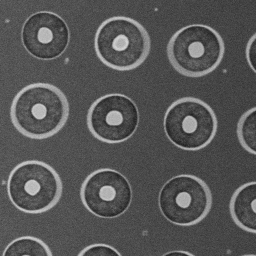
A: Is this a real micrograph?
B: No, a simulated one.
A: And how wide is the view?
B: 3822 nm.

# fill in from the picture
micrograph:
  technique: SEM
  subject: an array of small figures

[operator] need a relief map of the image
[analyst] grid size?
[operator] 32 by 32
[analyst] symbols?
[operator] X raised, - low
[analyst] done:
XXXXXXXXXXXXXXXXXXXXXXXXXXXXXXXX
XXXXXXXXXXXXXXXXXXXXXXXXXXXXXXXX
XXX-----XXXXXX--XXXXXXXXXXXXXXXX
XXX-----XXXXX-----XXXXX---XXXXXX
XXX--X---XXX------XXXX-----XXXXX
XXX-----XXXX--XX--XXX---X---XXX-
XXXX----XXXX------XXX---X---XXX-
XXXXXXXXXXXXX-----XXXX-----XXXX-
XXXXXXXXXXXXXXX-XXXXXX-----XXXXX
XXXXXXXXXXXXXXXXXXXXXXXXXXXXXXXX
XXXXXXXXXXXXXXXXXXXXXXXXXXXXXXXX
XXX----XXXXXXXXXXXXXXXXXXXXXXXXX
XX------XXXX----XXXXXXX-XXXXXXXX
XX--XX--XXXX-----XXXX-----XXXXXX
XX--X---XXX--XX--XXXX------XXXX-
XX------XXX---X--XXXX--XX--XXX--
XXX----XXXXX-----XXXX--X---XXX--
XXXXXXXXXXXXX--XXXXXX-----XXXX--
XXXXXXXXXXXXXXXXXXXXXXX--XXXXXX-
XXXXXXXXXXXXXXXXXXXXXXXXXXXXXXXX
XXX--XXXXXXXXXXXXXXXXXXXXXXXXXXX
XX-----XXXXX--XXXXXXXXXXXXXXXXXX
X------XXXX-----XXXXX----XXXXXXX
X--XX--XXX---X--XXXX------XXXX--
X------XXX---X--XXXX--XX--XXX---
XX-----XXXX-----XXXX--XX--XXX---
XXXXXXXXXXXX---XXXXX------XXX---
XXXXXXXXXXXXXXXXXXXXX----XXXXX--
XXXXXXXXXXXXXXXXXXXXXXXXXXXXXXX-
XXXXXXXXXXXXXXXXXXXXXXXXXXXXXXXX
X----XXXXXXXXXXXXXXXXXXXXXXXXXXX
X-----XXXX-----XXXXXXX-XXXXXXXXX